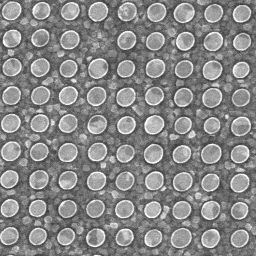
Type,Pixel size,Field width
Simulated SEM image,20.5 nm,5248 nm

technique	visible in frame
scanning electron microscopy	a regular array of raised bodies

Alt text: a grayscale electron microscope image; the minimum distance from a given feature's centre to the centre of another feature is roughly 570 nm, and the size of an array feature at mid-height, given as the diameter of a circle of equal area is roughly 365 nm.